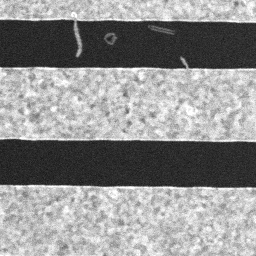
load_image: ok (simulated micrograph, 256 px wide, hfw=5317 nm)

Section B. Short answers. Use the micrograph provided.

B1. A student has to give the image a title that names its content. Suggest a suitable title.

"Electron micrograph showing wiring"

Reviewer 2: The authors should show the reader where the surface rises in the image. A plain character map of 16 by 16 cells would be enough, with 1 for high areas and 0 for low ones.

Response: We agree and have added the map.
1111111111111111
0000000000000000
0000000000000000
0000000000000000
1111111111111111
1111111111111111
1111111111111111
1111111111111111
1111111111111111
0000000000000000
0000000000000000
0000000000000000
1111111111111111
1111111111111111
1111111111111111
1111111111111111